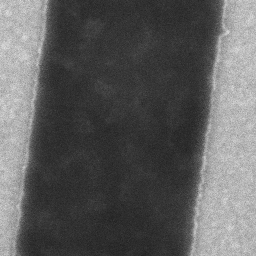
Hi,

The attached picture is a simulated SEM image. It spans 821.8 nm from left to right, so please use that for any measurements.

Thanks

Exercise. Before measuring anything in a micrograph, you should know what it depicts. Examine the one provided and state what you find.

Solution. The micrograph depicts one or a few lines or trenches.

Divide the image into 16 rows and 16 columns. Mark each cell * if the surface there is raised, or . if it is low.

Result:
...***********..
...***********..
...***********..
..************..
..***********...
..***********...
..***********...
..***********...
..***********...
..***********...
..***********...
.************...
.***********....
.***********....
.***********....
.***********....